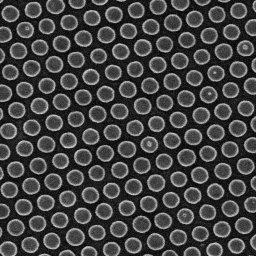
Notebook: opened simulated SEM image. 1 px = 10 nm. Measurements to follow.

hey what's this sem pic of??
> a regular array of raised bodies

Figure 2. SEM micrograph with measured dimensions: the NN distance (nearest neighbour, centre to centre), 218 nm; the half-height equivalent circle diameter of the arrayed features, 158 nm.